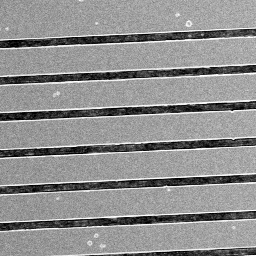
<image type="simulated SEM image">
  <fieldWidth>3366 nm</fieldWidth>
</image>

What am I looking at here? parallel lines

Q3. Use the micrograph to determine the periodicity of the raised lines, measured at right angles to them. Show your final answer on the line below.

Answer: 0.479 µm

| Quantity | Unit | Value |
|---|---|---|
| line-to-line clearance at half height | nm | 112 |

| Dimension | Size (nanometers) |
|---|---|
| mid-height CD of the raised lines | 368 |